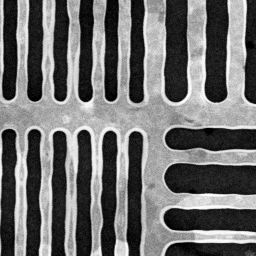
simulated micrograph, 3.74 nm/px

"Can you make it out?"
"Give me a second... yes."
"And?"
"groups of lines, slits or small figures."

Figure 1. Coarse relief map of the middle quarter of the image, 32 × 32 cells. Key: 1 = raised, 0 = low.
00100000110000110000111110000001
00100001110000110000111110000001
00100001110000110000111110000001
01100001110000110000111110000001
01100001110000110000111110000001
01100001110000110000111110000000
01100001110000110000111110000000
01100001110000110000111110000001
01110001110001110000011110000001
11110001111011111000111111000011
11111111111111111111111111111111
11111111111111111111111111111111
11111111111111111111111111111111
11111111111111111111111111111111
11111111111111111111111111111111
11111111111111111111111111110111
11110011110001111001111111000000
01100001110000110000111110000000
01100001100000110000111110000000
01100001100000110000111110000000
01100001100000100000111111000000
01100001100000100000111111110011
01100001100000110000111111111111
01100001100000110000111111111111
01100001100000110000111111111111
01100000100000110000111111000000
01100000100000110000111111000000
01100001100000110000111110000000
01100001100000110000111110000000
01100001100000110000111110000000
01100001100001110000111111000000
01100001100001110000111111000000